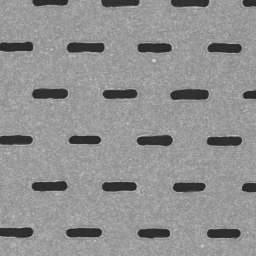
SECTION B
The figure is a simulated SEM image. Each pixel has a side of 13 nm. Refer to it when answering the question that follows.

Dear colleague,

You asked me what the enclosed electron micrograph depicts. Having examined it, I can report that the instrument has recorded a regular array of holes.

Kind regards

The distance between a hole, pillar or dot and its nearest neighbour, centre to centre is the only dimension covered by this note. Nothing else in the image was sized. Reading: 747 nanometres